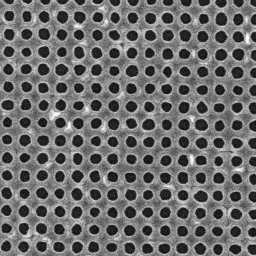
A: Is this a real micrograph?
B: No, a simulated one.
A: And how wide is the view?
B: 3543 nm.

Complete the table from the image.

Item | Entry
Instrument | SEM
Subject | a regular array of holes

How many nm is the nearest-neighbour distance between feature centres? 238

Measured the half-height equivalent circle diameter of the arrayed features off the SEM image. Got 155 nanometres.